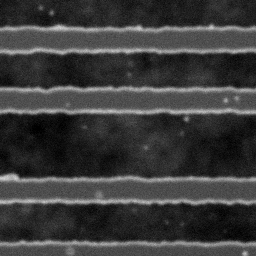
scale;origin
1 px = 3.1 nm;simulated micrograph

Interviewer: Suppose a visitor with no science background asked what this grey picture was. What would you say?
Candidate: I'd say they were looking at lines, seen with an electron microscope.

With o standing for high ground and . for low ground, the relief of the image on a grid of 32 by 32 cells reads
................................
................................
................................
ooooooo.oo...oooo...oooooooooooo
oooooooooooooooooooooooooooooooo
oooooooooooooooooooooooooooooooo
oooo...oo..o........oo...o...o..
................................
................................
................................
................................
oooooooooooooooooooooooooooooooo
oooooooooooooooooooooooooooooooo
oooooooooooooooooooooooooooooooo
................................
................................
................................
................................
................................
................................
................................
................................
oooooooooooooooooooooooooooooooo
oooooooooooooooooooooooooooooooo
oooooooooooooooooooooooooooooooo
................................
................................
................................
................................
................................
oooooooooooooooooooooooooooooooo
oooooooooooooooooooooooooooooooo